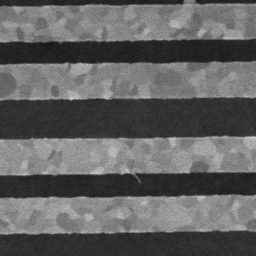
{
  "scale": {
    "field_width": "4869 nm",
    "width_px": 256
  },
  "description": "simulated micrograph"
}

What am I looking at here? lines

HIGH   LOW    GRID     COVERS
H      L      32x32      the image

LLLLLLLLLLLLLLLLLLLLLLLLLLLLLLLL
HHHHHHHHHHHHHHHHHHHHHHHHHHHHHHHH
HHHHHHHHHHHHHHHHHHHHHHHHHHHHHHHH
HHHHHHHHHHHHHHHHHHHHHHHHHHHHHHHH
HHHHHHHHHHHHHHHHHHHHHHHHHHHHHHHH
LLLLLLLLLLLLLLLLLLLLLLLLLLLLLLLL
LLLLLLLLLLLLLLLLLLLLLLLLLLLLLLLL
LLLLLLLLLLLLLLLLLLLLLLLLLLLLLLLL
HHHHHHHHHHHHHHHHHHHHHHHHHHHHHHHH
HHHHHHHHHHHHHHHHHHHHHHHHHHHHHHHH
HHHHHHHHHHHHHHHHHHHHHHHHHHHHHHHH
HHHHHHHHHHHHHHHHHHHHHHHHHHHHHHHH
LLLLLLLLLLLLLLLLLLLLLLLLLLLLLLLL
LLLLLLLLLLLLLLLLLLLLLLLLLLLLLLLL
LLLLLLLLLLLLLLLLLLLLLLLLLLLLLLLL
LLLLLLLLLLLLLLLLLLLLLLLLLLLLLLLL
LLLLLLLLLLLLLLLLLLLLLLLLLLLLLLLL
LLLHHHHHHHHHHHHHHHHHHHHHHHHHHHHH
HHHHHHHHHHHHHHHHHHHHHHHHHHHHHHHH
HHHHHHHHHHHHHHHHHHHHHHHHHHHHHHHH
HHHHHHHHHHHHHHHHHHHHHHHHHHHHHHHH
HHHHHHHHHHHHHHHHHHHHHHHHLLLLLLLL
LLLLLLLLLLLLLLLLLLLLLLLLLLLLLLLL
LLLLLLLLLLLLLLLLLLLLLLLLLLLLLLLL
LLLLLLLLLLLLLLLLLLLLLLLLLLHHHHLH
HHHHHHHHHHHHHHHHHHHHHHHHHHHHHHHH
HHHHHHHHHHHHHHHHHHHHHHHHHHHHHHHH
HHHHHHHHHHHHHHHHHHHHHHHHHHHHHHHH
HHHHHHHHHHHHHHHHHHHHHHHHHHHHHHHH
LLLLLLLLLLLLLLLLLLLLLLLLLLLLLLLL
LLLLLLLLLLLLLLLLLLLLLLLLLLLLLLLL
LLLLLLLLLLLLLLLLLLLLLLLLLLLLLLLL